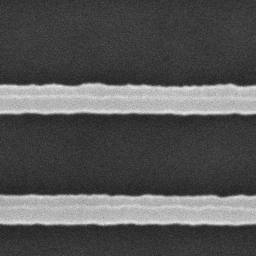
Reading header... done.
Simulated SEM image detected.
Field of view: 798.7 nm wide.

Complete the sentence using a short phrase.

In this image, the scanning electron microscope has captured lines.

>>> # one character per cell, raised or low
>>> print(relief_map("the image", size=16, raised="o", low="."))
................
................
................
................
................
oooooooooooooooo
oooooooooooooooo
................
................
................
................
................
oooooooooooooooo
oooooooooooooooo
................
................